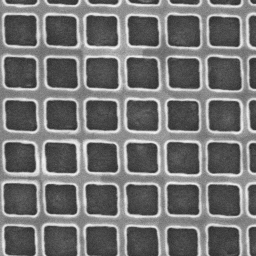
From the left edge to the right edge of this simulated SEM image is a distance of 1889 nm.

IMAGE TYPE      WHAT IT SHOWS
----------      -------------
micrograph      a regular array of holes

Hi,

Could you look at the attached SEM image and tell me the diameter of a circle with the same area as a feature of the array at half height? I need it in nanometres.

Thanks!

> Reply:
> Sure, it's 262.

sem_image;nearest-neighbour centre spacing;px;40.5